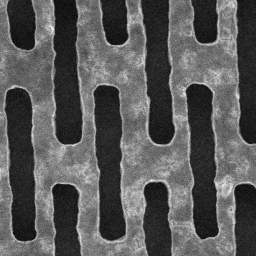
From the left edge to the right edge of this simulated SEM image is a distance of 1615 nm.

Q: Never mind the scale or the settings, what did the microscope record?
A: holes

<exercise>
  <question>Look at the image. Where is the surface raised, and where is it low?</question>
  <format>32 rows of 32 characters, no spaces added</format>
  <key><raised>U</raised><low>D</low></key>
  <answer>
UDDDUUUDDDUUUDDDUDDDDUUUDDDUUUDD
UDDDUUUDDDUUUDDDUUDDDUUUDDDUUUDD
UDDDDUUDDDUUUDDDUUDDDUUUDDDUUUDD
UDDDUUUDDDUUUDDDUUDDDUUUDDDUUUDD
UDDDUUUDDDUUUDDDUUDDDUUUDDDUUUDD
UUDDUUUDDDUUUUDUUUDDDUUUUDUUUUDD
UUUUUUUDDDUUUUUUUUDDDUUUUUUUUUDD
UUUUUUUDDDUUUUUUUUDDDUUUUUUUUUDD
UUUUUUUDDDUUUUUUUUDDDUUUUUUUUUDD
UUUUUUUDDDUUUUUUUUDDDUUUUUUUUUDD
UUUUUUUDDDUUUUUUUUDDDUUUDUUUUUDD
UDDUUUUDDDUUDDDUUUDDDUUDDDDUUUDD
UDDDUUUDDDUUDDDUUUUDDUUDDDDUUUDD
UDDDUUUDDDUUDDDUUUUDDDUDDDDUUUDD
UDDDUUUDDDUUDDDUUUUDDDUDDDDUUUDD
UDDDUUUDDDUUDDDUUUUDDDUUDDDUUUDD
UDDDUUUDDDUUDDDUUUUDDDUUDDDUUUDD
UDDDUUUDDDUUDDDUUUUDDDUUDDDUUUDD
UDDDUUUUUUUUDDDUUUUUUUUUDDDUUUUU
UDDDUUUUUUUUDDDUUUUUUUUUDDDUUUUU
UDDDUUUUUUUUDDDUUUUUUUUUDDDUUUUU
UDDDUUUUUUUUDDDUUUUUUUUUDDDUUUUU
UDDDUUUUUUUUDDDUUUUUUUUUDDDUUUUU
UDDDDUUDDDUUDDDUUUDDDUUUDDDUUDDD
UUDDUUUDDDUUDDDUUUDDDUUUDDDUUDDD
UDDDUUUDDDUUDDDUUUDDDUUUDDDUUDDD
UDDDDUUDDDUUDDDUUUDDDUUUDDDUUDDD
UDDDUUUDDDUUDDDDUUDDDUUUDDDUUDDD
UDDDUUUDDDUUDDDDUUDDDUUUDDDUUDDD
UUDDDUUDDDUUUDDDUUDDDUUUUDDUUDDD
UUUUUUUDDDUUUUUUUUDDDUUUUUUUUDDD
UUUUUUUDDDUUUUUUUUDDDUUUUUUUUDDD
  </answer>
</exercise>